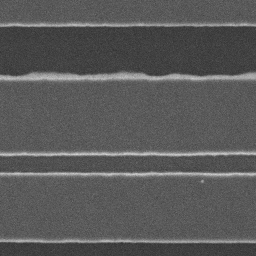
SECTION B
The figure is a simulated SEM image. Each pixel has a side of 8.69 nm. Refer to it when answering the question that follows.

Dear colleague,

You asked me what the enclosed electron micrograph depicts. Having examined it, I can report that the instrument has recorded lines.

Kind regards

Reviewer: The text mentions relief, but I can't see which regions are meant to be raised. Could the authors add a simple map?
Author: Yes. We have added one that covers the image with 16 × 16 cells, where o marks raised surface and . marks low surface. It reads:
oooooooooooooooo
oooooooooooooooo
................
................
................
oooooooooooooooo
oooooooooooooooo
oooooooooooooooo
oooooooooooooooo
oooooooooooooooo
oooooooooooooooo
oooooooooooooooo
oooooooooooooooo
oooooooooooooooo
oooooooooooooooo
................